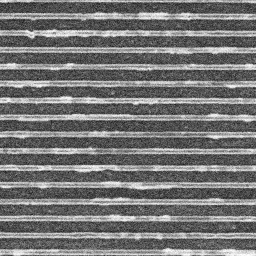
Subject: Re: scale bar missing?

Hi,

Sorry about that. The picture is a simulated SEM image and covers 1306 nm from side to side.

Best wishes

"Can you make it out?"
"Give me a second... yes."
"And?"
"parallel lines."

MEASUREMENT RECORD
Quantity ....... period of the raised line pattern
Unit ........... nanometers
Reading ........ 86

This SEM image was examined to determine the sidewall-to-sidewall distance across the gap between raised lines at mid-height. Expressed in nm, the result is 59.9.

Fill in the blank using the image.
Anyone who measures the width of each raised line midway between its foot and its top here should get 0.0255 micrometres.